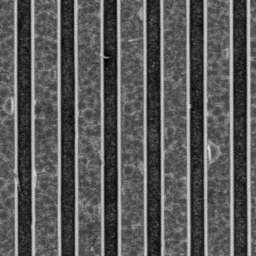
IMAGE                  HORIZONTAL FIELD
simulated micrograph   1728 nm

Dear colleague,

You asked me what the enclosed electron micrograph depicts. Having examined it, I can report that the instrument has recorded parallel lines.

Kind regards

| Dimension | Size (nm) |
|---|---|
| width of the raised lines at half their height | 181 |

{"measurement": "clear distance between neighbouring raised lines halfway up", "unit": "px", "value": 16.1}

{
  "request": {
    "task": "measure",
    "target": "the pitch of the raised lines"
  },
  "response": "291 nm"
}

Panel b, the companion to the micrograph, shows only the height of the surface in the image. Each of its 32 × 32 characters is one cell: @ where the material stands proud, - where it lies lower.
@@--@@@--@@@@--@@@--@@@---@@@--@
@@--@@@--@@@@--@@@--@@@---@@@--@
@@--@@@--@@@@--@@@--@@@---@@@--@
@@--@@@--@@@@--@@@--@@@---@@@--@
@@--@@@--@@@@--@@@--@@@---@@@--@
@@--@@@--@@@@--@@@--@@@---@@@--@
@@--@@@--@@@@--@@@--@@@---@@@--@
@@--@@@--@@@@--@@@--@@@---@@@--@
@@--@@@---@@@--@@@--@@@---@@@--@
@@--@@@---@@@--@@@--@@@---@@@--@
@@--@@@---@@@--@@@--@@@---@@@--@
@@--@@@---@@@--@@@--@@@---@@@--@
@@--@@@---@@@--@@@--@@@---@@@--@
@@--@@@---@@@--@@@--@@@@--@@@--@
@@--@@@---@@@--@@@--@@@---@@@--@
@@--@@@---@@@--@@@--@@@@--@@@--@
@@--@@@---@@@--@@@--@@@@--@@@--@
@@--@@@---@@@--@@@--@@@@--@@@--@
@@--@@@---@@@--@@@--@@@@--@@@--@
@@--@@@---@@@--@@@--@@@@--@@@--@
@@--@@@---@@@--@@@--@@@@--@@@--@
@@--@@@--@@@@--@@@--@@@@--@@@--@
@@--@@@---@@@--@@@--@@@@--@@@--@
@@--@@@---@@@--@@@--@@@@--@@@--@
@@--@@@---@@@--@@@--@@@@--@@@--@
@@--@@@---@@@--@@@--@@@@--@@@--@
@@--@@@---@@@--@@@--@@@@--@@@--@
@@--@@@---@@@--@@@--@@@@--@@@--@
@@--@@@---@@@--@@@--@@@@--@@@--@
@@--@@@---@@@--@@@--@@@@--@@@--@
@@--@@@---@@@--@@@--@@@@--@@@--@
@@--@@@---@@@--@@@--@@@@--@@@--@